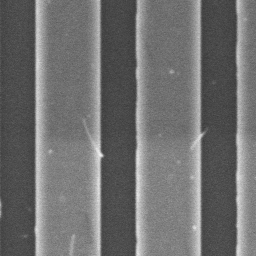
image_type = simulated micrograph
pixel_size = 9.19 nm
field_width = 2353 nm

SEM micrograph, lines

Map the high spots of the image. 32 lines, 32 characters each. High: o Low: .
.....ooooooo.....oooooooo.....oo
.....ooooooo.....oooooooo.....oo
.....ooooooo.....oooooooo.....oo
.....ooooooo.....oooooooo.....oo
.....ooooooo.....oooooooo.....oo
.....ooooooo.....oooooooo.....oo
.....ooooooo.....oooooooo.....oo
.....ooooooo.....oooooooo.....oo
.....ooooooo.....oooooooo.....oo
.....ooooooo.....oooooooo.....oo
.....ooooooo.....oooooooo.....oo
.....ooooooo.....oooooooo.....oo
.....ooooooo.....oooooooo.....oo
.....ooooooo.....oooooooo.....oo
.....ooooooo.....oooooooo.....oo
.....ooooooo.....oooooooo.....oo
.....ooooooo.....oooooooo.....oo
.....ooooooo.....oooooooo.....oo
.....ooooooo.....oooooooo.....oo
.....oooooooo....oooooooo.....oo
.....ooooooo.....oooooooo.....oo
.....ooooooo.....oooooooo.....oo
.....ooooooo.....oooooooo.....oo
.....ooooooo.....oooooooo.....oo
.....ooooooo.....oooooooo.....oo
.....ooooooo.....oooooooo.....oo
.....ooooooo.....oooooooo.....oo
.....ooooooo.....oooooooo.....oo
....oooooooo.....oooooooo.....oo
....oooooooo.....oooooooo.....oo
.....ooooooo.....oooooooo.....oo
.....ooooooo.....oooooooo.....oo